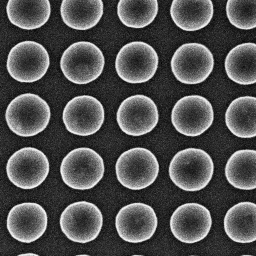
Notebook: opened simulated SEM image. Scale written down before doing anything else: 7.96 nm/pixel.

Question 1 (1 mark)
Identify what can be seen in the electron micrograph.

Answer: a regular array of raised bodies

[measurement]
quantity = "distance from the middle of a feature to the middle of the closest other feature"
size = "423 nanometers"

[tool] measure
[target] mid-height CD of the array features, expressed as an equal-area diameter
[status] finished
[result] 0.32 µm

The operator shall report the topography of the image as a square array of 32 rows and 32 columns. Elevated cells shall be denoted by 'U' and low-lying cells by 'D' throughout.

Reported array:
DUUUUUDDUUUUUDDUUUUUDDUUUUDDUUUU
DUUUUUDDUUUUUDDUUUUUDUUUUUDDUUUU
DUUUUUDDUUUUDDDUUUUDDDUUUUDDDUUU
DDDUDDDDDUUDDDDDDDDDDDDUUDDDDDUD
DDDDDDDDDDDDDDDDDDDDDDDDDDDDDDDD
DDUUUDDDDUUDDDDDUUDDDDDDDDDDDDDD
DUUUUUDDUUUUUDDUUUUDDDUUUUDDDUUU
DUUUUUDDUUUUUDDUUUUUDDUUUUUDUUUU
DUUUUUDDUUUUUDDUUUUDDDUUUUDDUUUU
DDUUUDDDUUUUDDDUUUUDDDUUUUDDDUUU
DDDDDDDDDDDDDDDDDDDDDDDDDDDDDDDD
DDDDDDDDDDDDDDDDDDDDDDDDDDDDDDDD
DDUUUDDDDUUUDDDDUUUDDDDUUUDDDUUU
DUUUUUDDUUUUUDDUUUUDDDUUUUDDDUUU
DUUUUUDDUUUUUDDUUUUUDDUUUUUDUUUU
DUUUUUDDUUUUUDDUUUUDDDUUUUDDUUUU
DDUUUDDDDUUUDDDDUUDDDDDUUDDDDUUU
DDDDDDDDDDDDDDDDDDDDDDDDDDDDDDDD
DDDDDDDDDDDDDDDDDDDDDDDDDDDDDDDD
DDUUUUDDUUUUDDDUUUUDDDUUUUDDDUUU
DUUUUUDDUUUUUDDUUUUUDUUUUUUDDUUU
DUUUUUDDUUUUUDDUUUUUDUUUUUUDUUUU
DUUUUDDDUUUUDDDUUUUDDDUUUUDDDUUU
DDDDDDDDDDUDDDDDUUDDDDDUUDDDDDUU
DDDDDDDDDDDDDDDDDDDDDDDDDDDDDDDD
DDDUDDDDDUUDDDDDDDDDDDDDDDDDDDUU
DUUUUUDDUUUUDDDUUUUDDDUUUUDDDUUU
DUUUUUDDUUUUUDDUUUUUDUUUUUDDUUUU
DUUUUUDDUUUUUDDUUUUDDUUUUUDDUUUU
DDUUUDDDUUUUDDDUUUUDDDUUUUDDDUUU
DDDDDDDDDDDDDDDDDDDDDDDDDDDDDDDD
DDDDDDDDDDDDDDDDDDDDDDDDDDDDDDDD